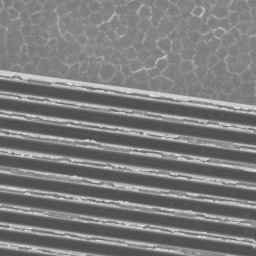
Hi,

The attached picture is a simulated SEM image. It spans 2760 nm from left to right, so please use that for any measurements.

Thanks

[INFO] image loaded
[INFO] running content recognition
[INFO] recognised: parallel lines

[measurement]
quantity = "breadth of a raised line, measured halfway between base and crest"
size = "98.8 nanometers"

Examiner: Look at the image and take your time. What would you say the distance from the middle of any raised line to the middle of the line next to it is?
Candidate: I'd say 200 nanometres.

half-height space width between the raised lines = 108 nm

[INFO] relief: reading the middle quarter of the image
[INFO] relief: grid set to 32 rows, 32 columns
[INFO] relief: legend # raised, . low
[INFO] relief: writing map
................................
................................
................................
................................
###.............................
##########......................
..###############...............
.........###############........
................################
####...................#########
###########...................##
....##############..............
...........##############.......
..................##############
######....................######
##############..................
.......##############...........
..............##############....
##...................###########
#########...................####
..##############................
.........##############.........
................##############..
####...................#########
###########...................##
....##############..............
...........##############.......
...................#############
#######...................######
##############..................
.......##############...........
..............##############....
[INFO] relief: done